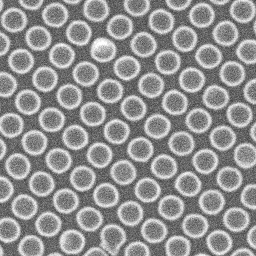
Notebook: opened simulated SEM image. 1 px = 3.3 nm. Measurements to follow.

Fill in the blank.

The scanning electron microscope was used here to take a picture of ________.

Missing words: a regular array of raised bodies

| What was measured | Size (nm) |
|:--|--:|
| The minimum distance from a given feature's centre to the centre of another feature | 94.5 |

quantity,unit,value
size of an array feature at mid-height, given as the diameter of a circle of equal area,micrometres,0.077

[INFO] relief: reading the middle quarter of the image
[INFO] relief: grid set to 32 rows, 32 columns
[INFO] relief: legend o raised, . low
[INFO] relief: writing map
o..oooo......oooooo....oooooo...
...ooooo.....oooooo.....oooo...o
..oooooo.....ooooo............oo
...ooooo......ooo...oooo.....ooo
....ooo...ooo......oooooo....ooo
.o.......ooooo.....oooooo....ooo
oooo.....ooooo.....ooooo.......o
oooo.....ooooo......oooo..ooo...
oooo.....ooooo..oo.......ooooo..
oooo...........ooooo.....oooooo.
ooo..oooo......ooooo.....oooooo.
....oooooo.....ooooo......oooo..
....oooooo.....ooooo...........o
....oooooo......ooo...ooo......o
.....oooo...oo.......ooooo.....o
...........ooooo....oooooo.....o
.oooo.....oooooo.....ooooo......
oooooo....oooooo.....oooo...ooo.
oooooo.....oooo............ooooo
oooooo......oo...oooo.....oooooo
.oooo..ooo......oooooo....oooooo
......ooooo.....oooooo.....ooooo
o.....oooooo....oooooo.......o..
o.....oooooo.....oooo..oooo.....
oo.....oooo...oo......oooooo....
o.......oo..ooooo.....oooooo....
...ooo......ooooo.....oooooo....
..ooooo.....oooooo.....oooo...oo
..ooooo.....oooooo...........ooo
..ooooo......ooo...oooo.....oooo
...oooo..ooo......oooooo....oooo
o.......ooooo.....oooooo.....ooo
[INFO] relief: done